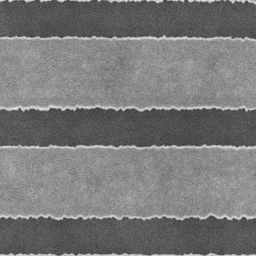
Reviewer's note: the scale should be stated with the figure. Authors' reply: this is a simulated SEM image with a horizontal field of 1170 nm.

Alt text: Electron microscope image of lines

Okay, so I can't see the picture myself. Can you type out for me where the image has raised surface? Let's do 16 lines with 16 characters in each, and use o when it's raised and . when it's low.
................
................
oooooooooooooooo
oooooooooooooooo
oooooooooooooooo
oooooooooooooooo
oooooooooooooooo
................
................
oooooooooooooooo
oooooooooooooooo
oooooooooooooooo
oooooooooooooooo
oooooooooooooooo
................
................